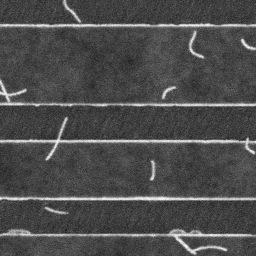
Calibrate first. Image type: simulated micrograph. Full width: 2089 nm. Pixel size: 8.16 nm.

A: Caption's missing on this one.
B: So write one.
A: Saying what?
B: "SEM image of lines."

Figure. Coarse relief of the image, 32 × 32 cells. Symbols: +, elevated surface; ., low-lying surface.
................................
................................
................................
++++++++++++++++++++++++++++++++
++++++++++++++++++++++++++++++++
++++++++++++++++++++++++++++++++
++++++++++++++++++++++++++++++++
++++++++++++++++++++++++++++++++
++++++++++++++++++++++++++++++++
++++++++++++++++++++++++++++++++
++++++++++++++++++++++++++++++++
++++++++++++++++++++++++++++++++
++++++++++++++++++++++++++++++++
................................
................................
................................
................................
.......+........................
++++++++++++++++++++++++++++++++
++++++++++++++++++++++++++++++++
++++++++++++++++++++++++++++++++
++++++++++++++++++++++++++++++++
++++++++++++++++++++++++++++++++
++++++++++++++++++++++++++++++++
++++++++++++++++++++++++++++++++
................................
................................
................................
................................
++++++++++++++++++++++++++++++++
++++++++++++++++++++++++++++++++
++++++++++++++++++++++++++++++++